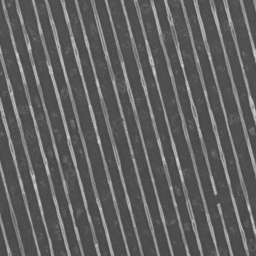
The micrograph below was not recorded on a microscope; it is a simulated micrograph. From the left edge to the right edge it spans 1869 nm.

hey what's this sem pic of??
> parallel lines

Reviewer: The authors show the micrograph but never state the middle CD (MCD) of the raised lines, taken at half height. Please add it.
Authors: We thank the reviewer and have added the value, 0.0185 microns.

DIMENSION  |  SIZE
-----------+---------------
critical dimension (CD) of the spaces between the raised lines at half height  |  0.0883 um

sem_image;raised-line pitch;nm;105